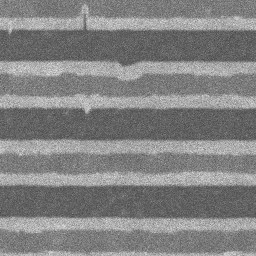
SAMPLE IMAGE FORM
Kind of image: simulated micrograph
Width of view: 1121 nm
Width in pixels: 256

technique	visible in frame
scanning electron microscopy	one or a few lines or trenches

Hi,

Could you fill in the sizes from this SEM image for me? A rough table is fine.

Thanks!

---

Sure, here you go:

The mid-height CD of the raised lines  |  153 nanometers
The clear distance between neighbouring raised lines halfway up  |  188 nm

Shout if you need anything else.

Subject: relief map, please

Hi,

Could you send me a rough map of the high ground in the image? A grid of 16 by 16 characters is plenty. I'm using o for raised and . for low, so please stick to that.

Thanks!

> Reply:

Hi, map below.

oooooooooooooooo
o.....oooooooooo
................
................
oooooooooooooooo
oooooooooooooooo
.....o..........
................
................
oooooooooooooooo
oooooooooooooooo
................
................
................
oooooooooooooooo
oooooooooooooooo